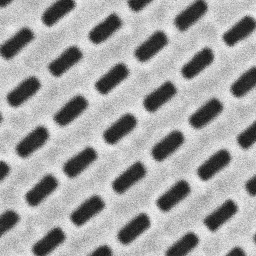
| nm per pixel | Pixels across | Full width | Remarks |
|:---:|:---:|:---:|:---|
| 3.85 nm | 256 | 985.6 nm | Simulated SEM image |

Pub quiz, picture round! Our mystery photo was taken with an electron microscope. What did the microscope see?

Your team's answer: a regular array of holes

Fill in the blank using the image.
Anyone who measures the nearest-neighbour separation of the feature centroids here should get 49.4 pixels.